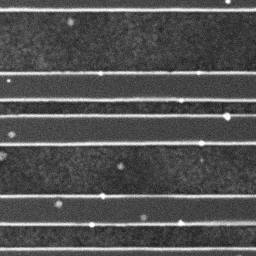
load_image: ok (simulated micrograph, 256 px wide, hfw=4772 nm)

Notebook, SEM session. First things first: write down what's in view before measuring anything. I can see lines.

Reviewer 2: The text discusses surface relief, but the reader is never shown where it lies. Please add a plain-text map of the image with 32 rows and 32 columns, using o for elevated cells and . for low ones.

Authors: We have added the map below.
oooooooooooooooooooooooooooooooo
................................
................................
................................
................................
................................
................................
................................
................................
oooooooooooooooooooooooooooooooo
oooooooooooooooooooooooooooooooo
oooooooooooooooooooooooooooooooo
ooo...ooooooooooo.....oooooooooo
................................
..o......oooo........ooo.oo.oooo
oooooooooooooooooooooooooooooooo
oooooooooooooooooooooooooooooooo
oooooooooooooooooooooooooooooooo
................................
................................
................................
................................
................................
................................
.ooooooooooooooooooooooooooooooo
oooooooooooooooooooooooooooooooo
oooooooooooooooooooooooooooooooo
oooooooooooooooooooooooooooooooo
................................
................................
................................
oooooooooooooooooooooooooooooooo